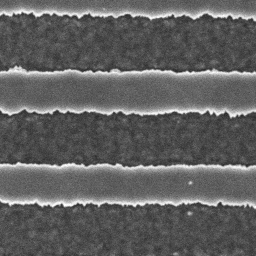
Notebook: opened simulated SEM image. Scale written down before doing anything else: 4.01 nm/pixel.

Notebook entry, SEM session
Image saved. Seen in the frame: lines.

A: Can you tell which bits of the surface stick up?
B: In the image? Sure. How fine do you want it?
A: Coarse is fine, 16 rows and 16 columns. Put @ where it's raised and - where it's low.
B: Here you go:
@@@@@@@@@@@@@@@@
----------------
----------------
----------------
@@@@@@@@@@@-@@@-
@@@@@@@@@@@@@@@@
@@@@@@@@@@@@@@@@
----------------
----------------
----------------
@@@@@@@@@@@@@@@@
@@@@@@@@@@@@@@@@
@@@@@@@@@@@@@@@@
----------------
----------------
----------------